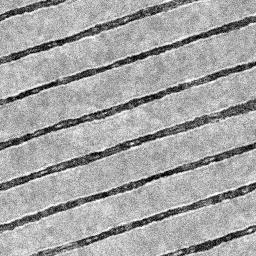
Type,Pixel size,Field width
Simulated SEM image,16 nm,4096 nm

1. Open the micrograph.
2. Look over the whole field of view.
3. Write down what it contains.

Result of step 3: parallel lines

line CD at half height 506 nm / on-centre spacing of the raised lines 635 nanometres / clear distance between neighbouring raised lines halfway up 124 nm